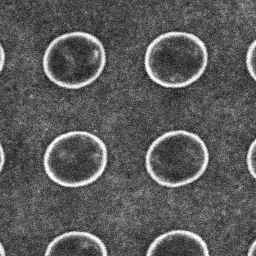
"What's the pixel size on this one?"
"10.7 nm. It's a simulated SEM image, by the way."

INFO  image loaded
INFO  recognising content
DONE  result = raised bodies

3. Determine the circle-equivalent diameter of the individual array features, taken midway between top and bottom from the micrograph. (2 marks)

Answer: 594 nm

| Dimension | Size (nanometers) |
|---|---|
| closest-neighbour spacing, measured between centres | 1060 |